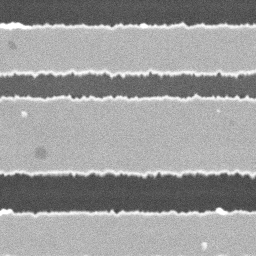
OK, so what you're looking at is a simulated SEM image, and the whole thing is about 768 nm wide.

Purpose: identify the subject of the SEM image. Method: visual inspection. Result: lines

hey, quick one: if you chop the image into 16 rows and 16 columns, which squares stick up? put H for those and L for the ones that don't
LLLLLLLLLLLLLLLL
HLLLLLLLLLLLLLLL
HHHHHHHHHHHHHHHH
HHHHHHHHHHHHHHHH
HHHHHHHHHHHHHHHH
HHHHHHHHHHHHHHHH
HHHHHHHHHHHHHHHH
HHHHHHHHHHHHHHHH
HHHHHHHHHHHHHHHH
HHHHHHHHHHHHHHHH
HHHHHHHHHHHHHHHH
LLLLLLLLLLLLLLLL
LLLLLLLLLLLLLLLL
HHHHHHHHHHHHHHHH
HHHHHHHHHHHHHHHH
HHHHHHHHHHHHHHHH